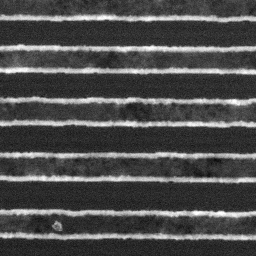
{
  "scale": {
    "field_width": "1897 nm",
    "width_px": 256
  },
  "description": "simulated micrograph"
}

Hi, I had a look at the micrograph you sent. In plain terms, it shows lines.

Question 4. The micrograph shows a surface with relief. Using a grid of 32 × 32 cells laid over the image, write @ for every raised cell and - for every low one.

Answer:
@@@@@@@@@@@@@@@@@@@@@@@@@@@@@@@@
@@@@@@@@@@@@@@@@@@@@@@@@@@@@@@@@
--------------------------------
--------------------------------
--------------------------------
--------------------------------
@@@@@@@@@@@@@@@@@@@@@@@@@@@@@@@@
@@@@@@@@@@@@@@@@@@@@@@@@@@@@@@@@
@@@@@@@@@@@@@@@@@@@@@@@@@@@@@@@@
--------------------------------
--------------------------------
--------------------------------
---@@@-----@@---@@--------------
@@@@@@@@@@@@@@@@@@@@@@@@@@@@@@@@
@@@@@@@@@@@@@@@@@@@@@@@@@@@@@@@@
-----------@@@--@@@@@@@@@@@@@@@@
--------------------------------
--------------------------------
--------------------------------
@@@@@@@@@@@@@@@@@@@@@@@-@@@@@---
@@@@@@@@@@@@@@@@@@@@@@@@@@@@@@@@
@@@@@@@@@@@@@@@@@@@@@@@@@@@@@@@@
----------------------@-@@@@@@@@
--------------------------------
--------------------------------
--------------------------------
@@@@@@@@@-@@@-------------------
@@@@@@@@@@@@@@@@@@@@@@@@@@@@@@@@
@@@@@@@@@@@@@@@@@@@@@@@@@@@@@@@@
@@-@@@@@@@@@@@@@@@@@@@@@@@@@@@@@
--------------------------------
--------------------------------